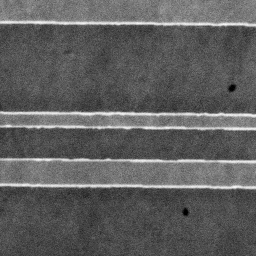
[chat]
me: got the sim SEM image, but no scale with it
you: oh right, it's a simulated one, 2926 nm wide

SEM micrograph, lines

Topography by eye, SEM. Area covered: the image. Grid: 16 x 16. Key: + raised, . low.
++++++++++++++++
.............+++
................
................
................
................
................
++++++++++++++++
++++++++++++++++
++++++++++++++++
++++++++++++++++
++++++++++++++++
................
................
................
................